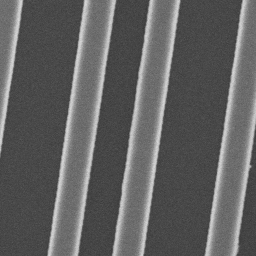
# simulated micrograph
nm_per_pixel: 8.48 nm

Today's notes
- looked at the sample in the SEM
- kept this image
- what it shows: lines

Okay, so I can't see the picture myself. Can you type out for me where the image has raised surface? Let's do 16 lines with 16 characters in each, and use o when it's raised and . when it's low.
o....oo..oo....o
o....oo..oo....o
o....oo..oo....o
o....oo..oo....o
o....oo..oo....o
o...oo...o....oo
....oo..oo....oo
....oo..oo....oo
....oo..oo....oo
....oo..oo....oo
....oo..oo....oo
....oo..oo...oo.
....o...o....oo.
...oo..oo....oo.
...oo..oo....oo.
...oo..oo....oo.